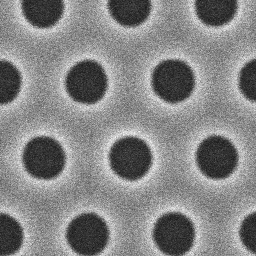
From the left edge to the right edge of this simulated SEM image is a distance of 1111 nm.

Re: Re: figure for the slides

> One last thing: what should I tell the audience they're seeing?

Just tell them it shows holes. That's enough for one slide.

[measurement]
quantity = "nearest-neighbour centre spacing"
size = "376 nanometers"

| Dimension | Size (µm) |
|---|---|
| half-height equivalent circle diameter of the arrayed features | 0.198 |